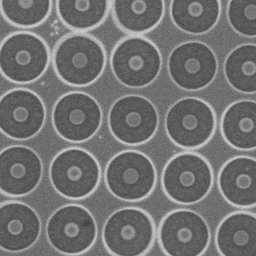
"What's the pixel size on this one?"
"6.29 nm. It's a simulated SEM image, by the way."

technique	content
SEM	an array of small figures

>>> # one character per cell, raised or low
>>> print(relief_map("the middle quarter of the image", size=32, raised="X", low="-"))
---XX-----XX-----XX-----XX----XX
----------XX------------XX-----X
---------XXXX----------XXXX-----
--------XXXXX----------XXXX-----
X------XXXXXXXX-------XXXXXX----
XXXXXXXXXXXXXXXXX---XXXXXXXXX---
XXXXXXXXXXXXXXXXXXXXXXXXXXXXXXXX
X----XXXXXXXXXXXXXXXXXXXXXXXXXXX
-------XXXXXXXX----XXXXXXXXXXXX-
--------XXXXX--------XXXXXXXX---
---------XXX----------XXXXX-----
---------XXX-----------XXX------
--XXX----XX-----XX-----XXX------
--XXX----XX-----XXX----XXX----XX
--XX-----XX-----XXX----XX-----XX
---------XXX-----X-----XXX----XX
--------XXXX-----------XXX------
-------XXXXX----------XXXX------
------XXXXXXX--------XXXXXX-----
XXXXXXXXXXXXXXX-----XXXXXXXX----
XXXXXXXXXXXXXXXXXXXXXXXXXXXXX---
X----XXXXXXXXXXXXXXXXXXXXXXXXXXX
------XXXXXXXX-----XXXXXXXXXX---
-------XXXXX---------XXXXXX-----
--------XXXX----------XXXX------
---------XX-----------XXXX------
--XX-----XX-----XX-----XX-------
-XXX-----X-----XXX-----XX-----XX
--X------X-----XXX-----XX----XXX
--------XXX-----XX-----XX----XXX
--------XXX-----------XXX-------
-------XXXXX----------XXX-------